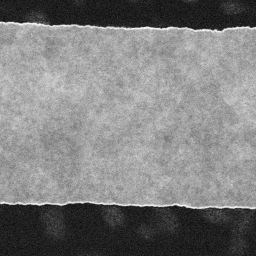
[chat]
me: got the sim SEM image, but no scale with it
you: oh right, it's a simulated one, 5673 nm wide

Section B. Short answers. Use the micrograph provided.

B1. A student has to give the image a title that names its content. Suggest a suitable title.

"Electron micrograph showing one or a few lines or trenches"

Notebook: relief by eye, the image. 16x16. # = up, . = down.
................
##..............
################
################
################
#############.##
################
################
################
################
################
################
################
................
................
................